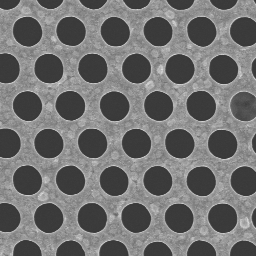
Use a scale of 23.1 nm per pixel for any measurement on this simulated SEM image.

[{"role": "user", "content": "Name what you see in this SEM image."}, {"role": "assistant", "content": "a regular array of holes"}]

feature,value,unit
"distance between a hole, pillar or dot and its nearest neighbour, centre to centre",986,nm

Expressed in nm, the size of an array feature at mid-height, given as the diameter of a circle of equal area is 682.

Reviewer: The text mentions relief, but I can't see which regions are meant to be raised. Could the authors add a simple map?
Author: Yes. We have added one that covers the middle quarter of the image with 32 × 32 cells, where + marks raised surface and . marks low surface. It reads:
++++.......++++.......+++.......
++++.......+++........+++.......
++++.......++++.......++++......
+++++.....+++++......+++++......
++++++...++++++++...+++++++....+
++++++++++++++++++++++++++++++++
++++++++++++++++++++++++++++++++
....++++++.....+++++++....++++++
.....++++.......++++.......++++.
.....++++.......++++.......++++.
.....++++.......++++.......++++.
.....++++.......++++.......++++.
.....+++++......+++++......++++.
....+++++++....++++++.....++++++
++++++++++++++++++++++++++++++++
++++++++++++++++++++++++++++++++
+++++....+++++++....+++++++...++
++++......+++++......+++++......
++++......+++++.......+++.......
+++........+++........+++.......
++++.......++++.......+++.......
++++......+++++......+++++......
+++++.....++++++.....+++++......
++++++...++++++++..+++++++++..++
++++++++++++++++++++++++++++++++
+..+++++++++.+++++++++..++++++++
....++++++.....++++++.....++++++
.....++++.......++++.......++++.
.....++++.......++++.......++++.
.....++++.......++++.......++++.
.....++++.......++++.......++++.
....++++++......+++++......+++++